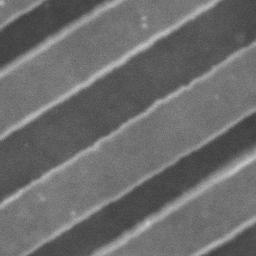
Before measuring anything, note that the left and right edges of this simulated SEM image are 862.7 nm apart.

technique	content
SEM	lines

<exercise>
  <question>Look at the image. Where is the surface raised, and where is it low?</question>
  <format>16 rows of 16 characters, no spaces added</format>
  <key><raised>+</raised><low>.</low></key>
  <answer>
++....+++++++...
.....++++++.....
...+++++++......
..++++++......++
++++++.......+++
+++++......+++++
+++.......++++++
++......+++++++.
.......+++++++..
.....+++++++....
....++++++.....+
..+++++++....+++
+++++++....+++++
++++++....++++++
++++....+++++++.
++.....++++++...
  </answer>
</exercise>